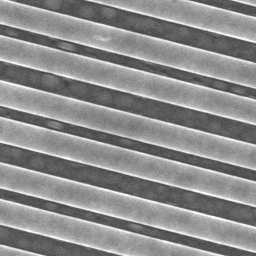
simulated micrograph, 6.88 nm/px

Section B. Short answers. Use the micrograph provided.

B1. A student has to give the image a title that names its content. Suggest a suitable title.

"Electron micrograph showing parallel lines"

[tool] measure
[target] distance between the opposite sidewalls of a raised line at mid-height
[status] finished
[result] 0.169 um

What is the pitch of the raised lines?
0.273 µm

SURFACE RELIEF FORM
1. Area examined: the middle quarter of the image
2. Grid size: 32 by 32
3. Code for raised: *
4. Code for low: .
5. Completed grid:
***************...........******
*******************...........**
***********************.........
..*************************.....
......************************..
..........**********************
..............******************
.................***************
*.........*..........***********
*****....................*******
*********....................***
*************...................
*****************...............
*********************...........
*************************.......
....*************************...
........************************
*...........********************
*****...........****************
*********......*....************
*************...........********
*****************...........****
*********************...........
*************************.......
....*************************...
........************************
............********************
................****************
...................*************
***.....................********
*******.....................****
***********.....................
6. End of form